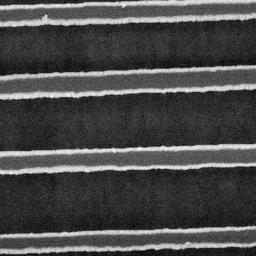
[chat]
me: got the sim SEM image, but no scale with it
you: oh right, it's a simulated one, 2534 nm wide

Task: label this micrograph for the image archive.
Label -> lines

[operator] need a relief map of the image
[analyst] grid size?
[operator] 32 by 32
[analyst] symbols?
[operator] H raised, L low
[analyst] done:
LLLLLLLLLLHHHHHHHHHHHHHHHHHHHHHH
HHHHHHHHHHHHHHHHHHHHHHHHHHHHHHHH
HHHHHHHHHHHHHHHHHHHHHHHHHLLLLLLL
LLLLLLLLLLLLLLLLLLLLLLLLLLLLLLLL
LLLLLLLLLLLLLLLLLLLLLLLLLLLLLLLL
LLLLLLLLLLLLLLLLLLLLLLLLLLLLLLLL
LLLLLLLLLLLLLLLLLLLLLLLLLLLLLLLL
LLLLLLLLLLLLLLLLLLLLLLLLLLLLLLLL
LLLLLLLLLLLLLLLLLLLLLLLLLHHHHHHH
LHHHHHHHHHHHHHHHHHHHHHHHHHHHHHHH
HHHHHHHHHHHHHHHHHHHHHHHHHHHHHHHH
HHHHHHHHHHHHHHHHHHLHHLLLLLLLLLLL
LLLLLLLLLLLLLLLLLLLLLLLLLLLLLLLL
LLLLLLLLLLLLLLLLLLLLLLLLLLLLLLLL
LLLLLLLLLLLLLLLLLLLLLLLLLLLLLLLL
LLLLLLLLLLLLLLLLLLLLLLLLLLLLLLLL
LLLLLLLLLLLLLLLLLLLLLLLLLLLLLLLL
LLLLLLLLLLLLLLLLLLLLLLLLLLLLLLLL
LLLLLLLLLLLLLLLLLLLLHHHHHHHHHHHH
HHHHHHHHHHHHHHHHHHHHHHHHHHHHHHHH
HHHHHHHHHHHHHHHHHHHHHHHHHHHHHHHH
HHHLLLLLLLLLLLLLLLLLLLLLLLLLLLLL
LLLLLLLLLLLLLLLLLLLLLLLLLLLLLLLL
LLLLLLLLLLLLLLLLLLLLLLLLLLLLLLLL
LLLLLLLLLLLLLLLLLLLLLLLLLLLLLLLL
LLLLLLLLLLLLLLLLLLLLLLLLLLLLLLLL
LLLLLLLLLLLLLLLLLLLLLLLLLLLLLLLL
LLLLLLLLLLLLLLLLLLLLLLLLLLLLLLLL
LLLLLLLLLLLLLLLLLLLLLLLLLLLLLLHH
HHHHHHHHHHHHHHHHHHHHHHHHHHHHHHHH
HHHHHHHHHHHHHHHHHHHHHHHHHHHHHHHH
HHHHLLLLLLLLLLLLLLLLLLLLLLLLLLLL